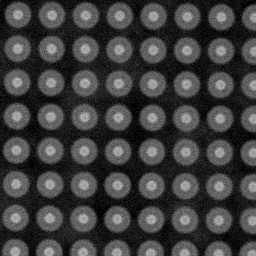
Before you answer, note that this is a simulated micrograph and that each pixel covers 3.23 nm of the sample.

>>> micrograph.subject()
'an array of small figures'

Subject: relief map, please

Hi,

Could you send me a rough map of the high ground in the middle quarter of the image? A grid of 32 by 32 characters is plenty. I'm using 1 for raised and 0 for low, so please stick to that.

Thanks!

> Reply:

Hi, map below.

00000000000000000000000000000000
00000000000000000000000000000000
00011111000011110000111100000111
00111111000111111001111110001111
00111111000111111001111110001111
00111111000111111001111110001111
00011111000111111001111110001111
00011110000011110000111100000111
00000000000000000000000000000000
00000000000000000000000000000000
00011110000011100000011000000010
00111111000111110000111110001111
00111111000111111001111110001111
00111111001111111001111110011111
00111111000111111001111110001111
00011111000111110000111110001111
00000100000001000000011000000111
00000000000000000000000000000000
00000000000000000000000000000000
00011110000111110000111100001111
00111111000111110001111110001111
00111111001111111001111110011111
00111111001111111001111110011111
00111111000111110001111110001111
00011110000011110000111100001111
00000000000000000000000000000000
00000000000000000000000000000000
00011110000011100000011000000110
00111111000111110001111110001111
00111111001111111001111110011111
00111111001111111001111110011111
00111111001111110001111110011111